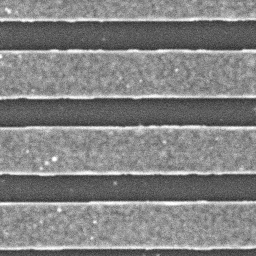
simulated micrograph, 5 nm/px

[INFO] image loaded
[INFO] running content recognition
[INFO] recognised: lines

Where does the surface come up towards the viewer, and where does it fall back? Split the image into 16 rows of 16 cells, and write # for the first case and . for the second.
################
................
................
################
################
################
................
................
################
################
################
................
................
################
################
################